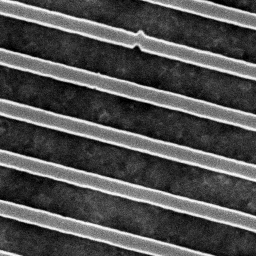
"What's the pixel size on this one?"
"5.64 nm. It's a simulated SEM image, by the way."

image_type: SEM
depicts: parallel lines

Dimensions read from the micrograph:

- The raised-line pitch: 0.276 µm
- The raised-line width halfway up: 79.2 nanometres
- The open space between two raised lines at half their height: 192 nanometers